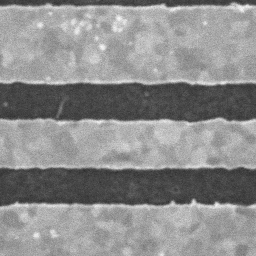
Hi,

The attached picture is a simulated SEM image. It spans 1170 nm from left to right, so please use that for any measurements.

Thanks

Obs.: lines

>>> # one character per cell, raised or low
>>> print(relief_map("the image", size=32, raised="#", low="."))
................................
################################
################################
################################
################################
################################
################################
################################
################################
################################
.........................##.....
................................
................................
................................
................................
################################
################################
################################
################################
################################
################################
................................
................................
................................
................................
....##...#...........#..#.......
################################
################################
################################
################################
################################
################################